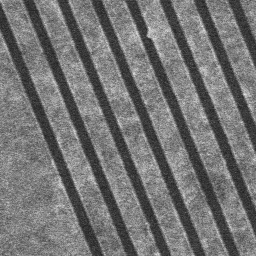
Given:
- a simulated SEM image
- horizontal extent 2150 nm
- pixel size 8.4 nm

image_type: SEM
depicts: parallel lines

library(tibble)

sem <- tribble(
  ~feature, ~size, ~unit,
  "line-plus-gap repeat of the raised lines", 0.266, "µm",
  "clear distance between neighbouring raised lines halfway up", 13.2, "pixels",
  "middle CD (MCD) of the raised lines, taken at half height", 156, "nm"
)